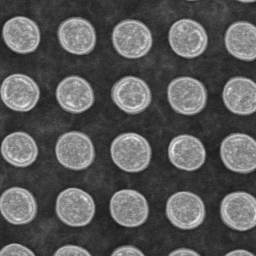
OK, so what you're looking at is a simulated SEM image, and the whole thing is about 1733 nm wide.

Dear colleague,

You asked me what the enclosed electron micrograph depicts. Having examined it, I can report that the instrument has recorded a regular array of raised bodies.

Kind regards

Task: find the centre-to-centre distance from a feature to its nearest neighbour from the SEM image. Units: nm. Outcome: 376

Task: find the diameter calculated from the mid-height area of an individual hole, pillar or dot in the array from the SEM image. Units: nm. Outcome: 254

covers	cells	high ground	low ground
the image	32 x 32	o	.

................................
................................
.ooo.....o......................
ooooo...ooo....ooo...oooo....ooo
ooooo..ooooo..ooooo..ooooo..oooo
.oooo...oooo..ooooo..ooooo..oooo
..oo.....oo....ooo....ooo....ooo
................................
................................
.oo.............................
oooo...oooo....ooo...oooo...oooo
ooooo..oooo...ooooo..ooooo..oooo
ooooo..ooooo..ooooo..ooooo..oooo
.ooo....ooo....ooo....ooo....ooo
................................
................................
................................
.ooo...oooo...oooo....ooo...oooo
ooooo..ooooo..ooooo..oooo...oooo
ooooo..ooooo..ooooo..ooooo..oooo
.ooo....ooo....ooo....ooo...oooo
................................
................................
................................
oooo...oooo...oooo...ooo....ooo.
oooo...ooooo..oooo...oooo...oooo
oooo...ooooo..oooo...oooo...oooo
.ooo....ooo...oooo...oooo...oooo
.......................o.....oo.
................................
.o..............................
oooo...oooo...ooo.....oo.....oo.